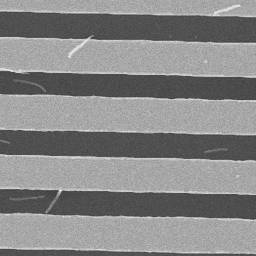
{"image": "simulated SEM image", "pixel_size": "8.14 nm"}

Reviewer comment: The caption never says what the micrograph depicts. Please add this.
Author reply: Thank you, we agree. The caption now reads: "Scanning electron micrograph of lines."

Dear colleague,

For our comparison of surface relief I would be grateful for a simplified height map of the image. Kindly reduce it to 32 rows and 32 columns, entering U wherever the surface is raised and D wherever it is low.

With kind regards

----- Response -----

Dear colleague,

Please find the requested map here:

UUUUUUUUUUUUUUUUUUUUUUUUUUUUUUUU
DDDDDDDUUUUUUUUUUUUUUUUUUUUUUUUU
DDDDDDDDDDDDDDDDDDDDDDDDDDDDDDDD
DDDDDDDDDDDDDDDDDDDDDDDDDDDDDDDD
DDDDDDDDDDDDDDDDDDDDDDDDDDDDDDDD
UUUUUUUUUUUUUUUUUUUUUUUUUUUUUUUU
UUUUUUUUUUUUUUUUUUUUUUUUUUUUUUUU
UUUUUUUUUUUUUUUUUUUUUUUUUUUUUUUU
UUUUUUUUUUUUUUUUUUUUUUUUUUUUUUUU
DDDDDDDDDDDDDDDDDDDDDDDDUUUUUUUU
DDDDDDDDDDDDDDDDDDDDDDDDDDDDDDDD
DDDDDDDDDDDDDDDDDDDDDDDDDDDDDDDD
UUUUUUUUUUUUUUUUUUUUUUUUUUDUUDDD
UUUUUUUUUUUUUUUUUUUUUUUUUUUUUUUU
UUUUUUUUUUUUUUUUUUUUUUUUUUUUUUUU
UUUUUUUUUUUUUUUUUUUUUUUUUUUUUUUU
DDDDDDDDDDDDDDDDDUUUUUUUUUUUUUUU
DDDDDDDDDDDDDDDDDDDDDDDDDDDDDDDD
DDDDDDDDDDDDDDDDDDDDDDDDDDDDDDDD
UUUUUUDDDDDDDDDDDDDDDDDDDDDDDDDD
UUUUUUUUUUUUUUUUUUUUUUUUUUUUUUUU
UUUUUUUUUUUUUUUUUUUUUUUUUUUUUUUU
UUUUUUUUUUUUUUUUUUUUUUUUUUUUUUUU
UUUUUUUUUUUUUUUUUUUUUUUUUUUUUUUU
DDDDDDDDDDDDDDDDDDDDDDDDDDDDDDDD
DDDDDDDDDDDDDDDDDDDDDDDDDDDDDDDD
DDDDDDDDDDDDDDDDDDDDDDDDDDDDDDDD
UUUUUUUUUUUUUUUUUUUUUUUUUUUUUUUU
UUUUUUUUUUUUUUUUUUUUUUUUUUUUUUUU
UUUUUUUUUUUUUUUUUUUUUUUUUUUUUUUU
UUUUUUUUUUUUUUUUUUUUUUUUUUUUUUUU
DDDDDDDDDDDDDDDDDDDDDDUUUUUUUUUU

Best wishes